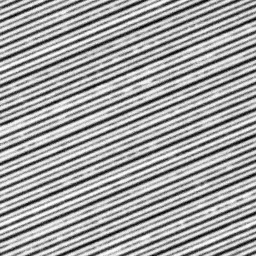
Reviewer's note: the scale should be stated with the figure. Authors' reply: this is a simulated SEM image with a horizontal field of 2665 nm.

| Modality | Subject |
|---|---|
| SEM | parallel lines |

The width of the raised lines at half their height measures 0.036 µm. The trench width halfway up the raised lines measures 36 nm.